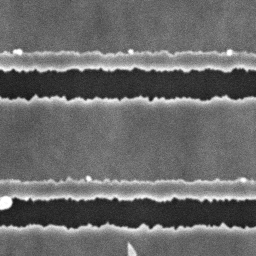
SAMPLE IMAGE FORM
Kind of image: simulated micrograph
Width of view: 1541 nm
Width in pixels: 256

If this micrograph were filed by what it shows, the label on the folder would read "lines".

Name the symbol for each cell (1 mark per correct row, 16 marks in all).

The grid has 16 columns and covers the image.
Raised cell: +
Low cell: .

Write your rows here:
++++++++++++++++
++++++++++++++++
++++++++++++++++
++++++++++++++++
................
................
++++++++++++++++
++++++++++++++++
++++++++++++++++
++++++++++++++++
++++++++++++++++
++++++++++++++++
+...............
................
++++++++++++++++
++++++++++++++++